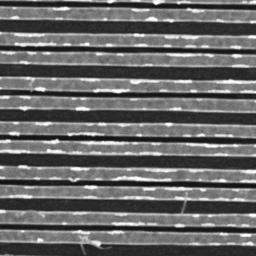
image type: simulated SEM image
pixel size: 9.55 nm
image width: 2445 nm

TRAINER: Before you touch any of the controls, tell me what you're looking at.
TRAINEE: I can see parallel lines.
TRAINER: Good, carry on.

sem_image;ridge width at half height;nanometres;122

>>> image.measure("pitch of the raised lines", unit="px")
22.3